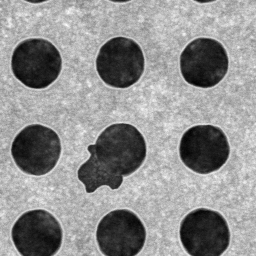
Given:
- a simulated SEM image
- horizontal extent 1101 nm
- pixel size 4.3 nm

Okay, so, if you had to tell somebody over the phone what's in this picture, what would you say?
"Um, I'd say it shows holes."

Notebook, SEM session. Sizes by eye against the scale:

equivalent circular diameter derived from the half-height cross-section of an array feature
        0.214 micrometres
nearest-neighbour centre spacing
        83.4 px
